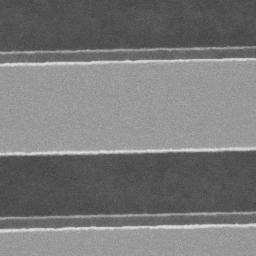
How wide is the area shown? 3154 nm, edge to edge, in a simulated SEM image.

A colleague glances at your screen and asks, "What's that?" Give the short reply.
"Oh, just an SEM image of lines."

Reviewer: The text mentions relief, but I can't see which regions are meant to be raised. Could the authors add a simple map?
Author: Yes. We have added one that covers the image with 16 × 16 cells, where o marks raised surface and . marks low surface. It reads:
................
................
................
................
oooooooooooooooo
oooooooooooooooo
oooooooooooooooo
oooooooooooooooo
oooooooooooooooo
oooooooo........
................
................
................
................
oooooooooooooooo
oooooooooooooooo